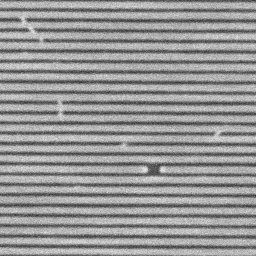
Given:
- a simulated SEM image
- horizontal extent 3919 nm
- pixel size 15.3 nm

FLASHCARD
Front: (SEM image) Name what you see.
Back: parallel lines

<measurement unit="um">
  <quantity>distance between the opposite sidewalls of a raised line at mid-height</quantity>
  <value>0.0899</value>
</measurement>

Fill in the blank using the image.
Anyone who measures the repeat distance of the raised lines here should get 157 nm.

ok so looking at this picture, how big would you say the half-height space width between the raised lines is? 76.5 nm